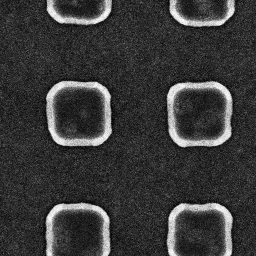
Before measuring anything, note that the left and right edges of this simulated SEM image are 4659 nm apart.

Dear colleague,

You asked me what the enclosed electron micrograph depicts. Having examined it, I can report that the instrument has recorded raised bodies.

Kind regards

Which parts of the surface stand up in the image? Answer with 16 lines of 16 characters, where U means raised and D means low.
DDDUUUUDDDDUUUDD
DDDDDDDDDDDDUDDD
DDDDDDDDDDDDDDDD
DDDDDDDDDDDDDDDD
DDDDDDDDDDDDDDDD
DDDDUUDDDDDUUUDD
DDDUUUUDDDDUUUDD
DDDUUUUDDDDUUUDD
DDDUUUUDDDDUUUDD
DDDDDDDDDDDDDDDD
DDDDDDDDDDDDDDDD
DDDDDDDDDDDDDDDD
DDDDDDDDDDDDDDDD
DDDUUUUDDDDUUUDD
DDDUUUUDDDDUUUDD
DDDUUUUDDDDUUUDD